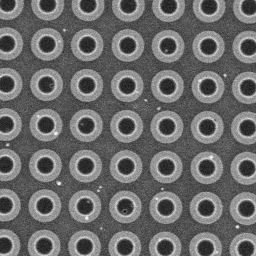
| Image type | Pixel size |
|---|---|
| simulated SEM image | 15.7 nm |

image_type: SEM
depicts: an array of small figures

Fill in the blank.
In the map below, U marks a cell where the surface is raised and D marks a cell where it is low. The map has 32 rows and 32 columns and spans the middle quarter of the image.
DDDDDDDDDDDDDDDDDDDDDDDDDDDDDDDD
DDDDUUUDDDDDDDDDDDDDDDDDDDDDDDDD
DDDUUUUUUDDDDUUUUUDDDDDUUUUUUDDD
DDUUUUUUUDDDUUUUUUUDDDUUUUUUUDDD
DDUUUUUUUUDDUUUUUUUUDDUUUUUUUUDD
DDUUUUUUUUDDUUUUUUUUDDUUUUUUUUDD
DDUUUUUUUDDDUUUUUUUUDDUUUUUUUUDD
DDUUUUUUUDDDUUUUUUUDDDUUUUUUUDDD
DDDUUUUUDDDDDUUUUUDDDDDUUUUUUDDD
DDDDDDDDDDDDDDDDDDDDDDDDDUUDDDDD
DDDDDDDDDDDDDDDDDDDDDDDDDDDDDDDD
DDDDDUUDDDDDDDDDDDDDDDDDDDDDDDDD
DDDUUUUUDDDDDUUUUUDDDDDUUUUUDDDD
DDUUUUUUUDDDUUUUUUUDDDUUUUUUUDDD
DDUUUUUUUDDDUUUUUUUUDDUUUUUUUUDD
DDUUUUUUUDDDUUUUUUUUDDUUUUUUUUDD
DDUUUUUUUDDDUUUUUUUUDDUUUUUUUUDD
DDUUUUUUUDDDUUUUUUUDDDUUUUUUUDDD
DDDUUUUUDDDDDUUUUUDDDDDUUUUUUDDD
DDDDDDDDDDDDDDDDUDDDDDDDUUUDDDDD
DDDDDDDDDDDDDDDDDDDDDDDDDDDDDDDD
DDDDDDDDDDDDDDDDDDDDDDDDDDDDDDDD
DDDUUUUUDDDDDUUUUUDDDDDUUUUUDDDD
DDUUUUUUUDDDUUUUUUUDDDUUUUUUUDDD
DDUUUUUUUDDDUUUUUUUDDDUUUUUUUDDD
DUUUUUUUUDDDUUUUUUUDDDUUUUUUUUDD
DUUUUUUUUDDDUUUUUUUDDDUUUUUUUUDD
DDUUUUUUUDDDUUUUUUUDDDUUUUUUUDDD
DDDUUUUUDDDDDUUUUUDDDDDUUUUUUDDD
DDDDDDDDDDDDDDUUUDDDDDDDUUUDDDDD
DDDDDDDDDDDDDDDDDDDDDDDDDDDDDDDD
DDDDDDDDDDDDDDDDDDDDDDDDDDDDDDDD